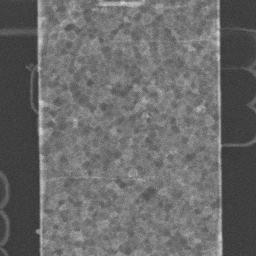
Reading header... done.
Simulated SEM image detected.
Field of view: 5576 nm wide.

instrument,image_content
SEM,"wiring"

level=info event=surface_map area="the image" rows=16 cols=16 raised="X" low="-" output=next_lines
--XXXXXXXXXXXX--
--XXXXXXXXXXXX--
--XXXXXXXXXXXX--
--XXXXXXXXXXXX--
--XXXXXXXXXXXX--
--XXXXXXXXXXXX--
--XXXXXXXXXXXX--
--XXXXXXXXXXXX--
--XXXXXXXXXXXX--
---XXXXXXXXXXX--
---XXXXXXXXXXX--
---XXXXXXXXXXX--
---XXXXXXXXXXX--
---XXXXXXXXXXX--
---XXXXXXXXXXX--
---XXXXXXXXXXX--